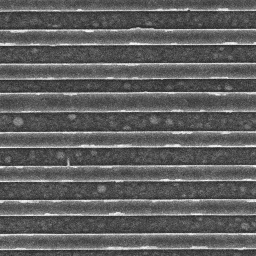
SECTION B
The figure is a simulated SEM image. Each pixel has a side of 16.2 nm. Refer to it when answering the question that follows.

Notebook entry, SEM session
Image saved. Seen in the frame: parallel lines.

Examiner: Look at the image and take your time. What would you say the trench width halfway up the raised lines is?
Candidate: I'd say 19.2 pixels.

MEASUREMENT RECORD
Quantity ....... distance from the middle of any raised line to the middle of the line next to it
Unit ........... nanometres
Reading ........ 553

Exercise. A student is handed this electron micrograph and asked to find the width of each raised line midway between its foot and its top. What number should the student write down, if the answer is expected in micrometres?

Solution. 0.249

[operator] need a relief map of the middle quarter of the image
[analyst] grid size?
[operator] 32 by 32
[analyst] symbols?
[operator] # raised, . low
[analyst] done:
################################
################################
################################
################################
................................
................................
................................
################################
################################
################################
################################
################################
................................
................................
................................
................................
................................
################################
################################
################################
################################
................................
................................
................................
................................
##..............................
################################
################################
################################
................................
................................
................................